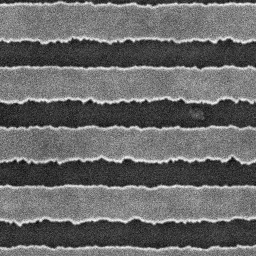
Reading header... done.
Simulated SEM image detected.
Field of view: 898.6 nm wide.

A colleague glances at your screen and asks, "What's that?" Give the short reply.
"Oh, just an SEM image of lines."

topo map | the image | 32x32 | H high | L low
LLHHHHHHHHHHLHLLHLLLLLLLHLLLHHHH
HHHHHHHHHHHHHHHHHHHHHHHHHHHHHHHH
HHHHHHHHHHHHHHHHHHHHHHHHHHHHHHHH
HHHHHHHHHHHHHHHHHHHHHHHHHHHHHHHH
HHHHHHHHHHHHHHHHHHHHHHHHHHHHHHHH
LLLLLLLLLLLLLLLLLLLLLLLLLLLLLLLL
LLLLLLLLLLLLLLLLLLLLLLLLLLLLLLLL
LLLLLLLLLLLLLLLLLLLLLLLLLLLLLLLL
HHHHHHHHHHLHHHHHHHHHHHHHHLHHHHHH
HHHHHHHHHHHHHHHHHHHHHHHHHHHHHHHH
HHHHHHHHHHHHHHHHHHHHHHHHHHHHHHHH
HHHHHHHHHHHHHHHHHHHHHHHHHHHHHHHH
HHHHHHHHLLHLHHHHHHHLLLLHHHHHLHHH
LLLLLLLLLLLLLLLLLLLLLLLLLLLLLLLL
LLLLLLLLLLLLLLLLLLLLLLLLLLLLLLLL
LLLLLLLLLLLLLLLLLLLLLLLLLLLLLLLL
HHHHHHHHHHHHHHHHHHHHHHHHHHHHHHHH
HHHHHHHHHHHHHHHHHHHHHHHHHHHHHHHH
HHHHHHHHHHHHHHHHHHHHHHHHHHHHHHHH
HHHHHHHHHHHHHHHHHHHHHHHHHHHHHHHH
LLLLLLLLLLLLLLLLLLLLLLLLLLLLLLLL
LLLLLLLLLLLLLLLLLLLLLLLLLLLLLLLL
LLLLLLLLLLLLLLLLLLLLLLLLLLLLLLLL
HHHHHHHHHHHHHHHHHHLHHHHHHHHHHHHH
HHHHHHHHHHHHHHHHHHHHHHHHHHHHHHHH
HHHHHHHHHHHHHHHHHHHHHHHHHHHHHHHH
HHHHHHHHHHHHHHHHHHHHHHHHHHHHHHHH
HHHHHLHHHHHHLHHHLHHHHHHHHHHHHLLL
LLLLLLLLLLLLLLLLLLLLLLLLLLLLLLLL
LLLLLLLLLLLLLLLLLLLLLLLLLLLLLLLL
LLLLLLLLLLLLLLLLLLLLLLLLLLLLLLLL
HHHHHHHHHHHHHHHHHHHHHHHHHHHHHHHH